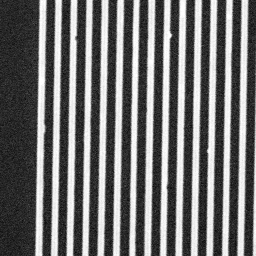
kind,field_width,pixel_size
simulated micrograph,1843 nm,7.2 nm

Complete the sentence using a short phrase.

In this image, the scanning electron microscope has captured parallel lines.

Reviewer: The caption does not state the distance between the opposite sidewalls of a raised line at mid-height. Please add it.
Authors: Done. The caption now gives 34.2 nanometers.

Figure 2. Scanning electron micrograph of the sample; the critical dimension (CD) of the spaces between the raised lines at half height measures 0.0747 µm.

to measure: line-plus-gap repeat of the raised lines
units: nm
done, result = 112